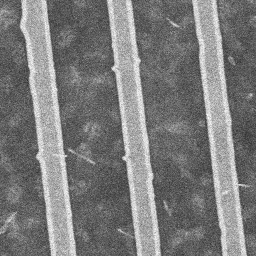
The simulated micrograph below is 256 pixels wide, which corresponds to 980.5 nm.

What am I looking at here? one or a few lines or trenches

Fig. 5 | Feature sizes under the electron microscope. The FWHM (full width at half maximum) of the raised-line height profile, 75.3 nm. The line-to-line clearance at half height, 249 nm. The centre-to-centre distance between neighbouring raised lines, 325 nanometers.